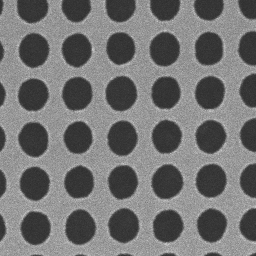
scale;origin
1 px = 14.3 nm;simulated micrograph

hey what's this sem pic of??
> a regular array of holes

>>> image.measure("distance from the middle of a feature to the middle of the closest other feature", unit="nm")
625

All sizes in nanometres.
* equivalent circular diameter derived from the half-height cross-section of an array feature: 468